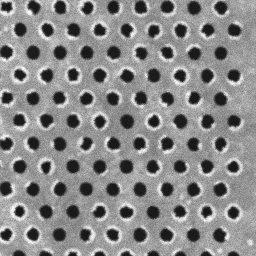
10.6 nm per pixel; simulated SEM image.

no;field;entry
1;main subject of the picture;a regular array of holes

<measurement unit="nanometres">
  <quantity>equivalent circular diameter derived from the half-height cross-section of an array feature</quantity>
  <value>143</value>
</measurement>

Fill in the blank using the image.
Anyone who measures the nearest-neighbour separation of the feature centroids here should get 275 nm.